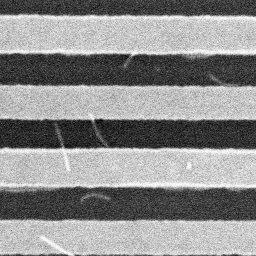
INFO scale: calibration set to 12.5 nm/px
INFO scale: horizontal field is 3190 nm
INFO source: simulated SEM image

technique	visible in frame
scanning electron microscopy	lines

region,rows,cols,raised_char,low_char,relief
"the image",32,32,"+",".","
................................
................................
++++++++++++++++++++++++++++++++
++++++++++++++++++++++++++++++++
++++++++++++++++++++++++++++++++
++++++++++++++++++++++++++++++++
++++++++++++++++++++++++++++++++
................................
................................
................................
................................
++++++++++++++++++++++++++++++++
++++++++++++++++++++++++++++++++
++++++++++++++++++++++++++++++++
++++++++++++++++++++++++++++++++
................................
................................
................................
.......+........................
++++++++++++++++++++++++++++++++
++++++++++++++++++++++++++++++++
++++++++++++++++++++++++++++++++
++++++++++++++++++++++++++++++++
................................
................................
................................
................................
................................
++++++++++++++++++++++++++++++++
++++++++++++++++++++++++++++++++
++++++++++++++++++++++++++++++++
++++++++++++++++++++++++++++++++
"